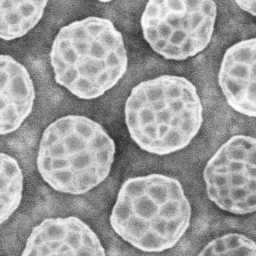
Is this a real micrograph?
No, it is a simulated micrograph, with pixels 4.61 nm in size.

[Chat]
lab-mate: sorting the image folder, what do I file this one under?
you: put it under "raised bodies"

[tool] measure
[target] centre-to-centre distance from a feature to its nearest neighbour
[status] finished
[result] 0.438 microns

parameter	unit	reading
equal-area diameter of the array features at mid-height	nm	347